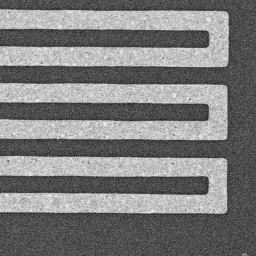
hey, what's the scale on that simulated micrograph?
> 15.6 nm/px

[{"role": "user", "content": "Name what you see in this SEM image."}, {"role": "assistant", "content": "groups of lines, slits or small figures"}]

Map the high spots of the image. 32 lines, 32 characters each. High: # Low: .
................................
############################....
############################....
########.###################....
..........................##....
..........................##....
############################....
############################....
................................
................................
................................
############################....
############################....
..........................##....
..........................##....
############################....
############################....
................................
................................
................................
############################....
############################....
..........................##....
..........................##....
############################....
############################....
...............#########.#.#....
................................
................................
................................
................................
................................